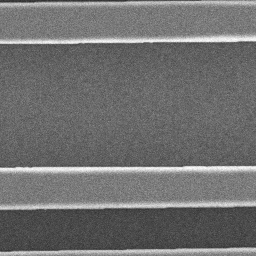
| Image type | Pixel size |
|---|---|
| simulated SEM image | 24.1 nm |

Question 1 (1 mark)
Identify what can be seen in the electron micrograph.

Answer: lines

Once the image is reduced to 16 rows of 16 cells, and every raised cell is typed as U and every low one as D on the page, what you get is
UUUUUUUUUUUUUUUU
UUUUUUUUUUUUUUUU
UUUUUUUUUUUUUUUD
DDDDDDDDDDDDDDDD
DDDDDDDDDDDDDDDD
DDDDDDDDDDDDDDDD
DDDDDDDDDDDDDDDD
DDDDDDDDDDDDDDDD
DDDDDDDDDDDDDDDD
DDDDDDDDDDDDDDDD
DDDDDDDUUUUUUUUU
UUUUUUUUUUUUUUUU
UUUUUUUUUUUUUUUU
DDDDDDDDDDDDDDDD
DDDDDDDDDDDDDDDD
DDDDDDDDDDDDDDDD